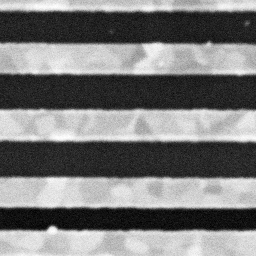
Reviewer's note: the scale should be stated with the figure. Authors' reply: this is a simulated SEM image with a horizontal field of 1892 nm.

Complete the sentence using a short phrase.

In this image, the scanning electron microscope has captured lines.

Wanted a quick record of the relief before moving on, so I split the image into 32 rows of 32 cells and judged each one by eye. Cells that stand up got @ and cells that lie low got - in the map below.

@@@@@@@@@@@@@@@@@@@@@@@@@@@@@@@@
--------------------------------
--------------------------------
--------------------------------
--------------------------------
@@@@@@-------------@@-----@-----
@@@@@@@@@@@@@@@@@@@@@@@@@@@@@@@@
@@@@@@@@@@@@@@@@@@@@@@@@@@@@@@@@
@@@@@@@@@@@@@@@@@@@@@@@@@@@@@@@@
--------------------------------
--------------------------------
--------------------------------
--------------------------------
--------------------------------
@@@@@@@@@@@@@@@@@@@@@@@@@@@@@@@@
@@@@@@@@@@@@@@@@@@@@@@@@@@@@@@@@
@@@@@@@@@@@@@@@@@@@@@@@@@@@@@@@@
--------------------------------
--------------------------------
--------------------------------
--------------------------------
--------------------------------
@@@@@@@@@@@@@@@@@@@@@@@@@@@@@@@@
@@@@@@@@@@@@@@@@@@@@@@@@@@@@@@@@
@@@@@@@@@@@@@@@@@@@@@@@@@@@@@@@@
@@@@@@@@@@@@@@@@@@@@@@@@@@@@@@@@
--------------------------------
--------------------------------
------@-------------------------
@@@@@@@@@@@@@@@@@@@@@@@@@@@@@@@@
@@@@@@@@@@@@@@@@@@@@@@@@@@@@@@@@
@@@@@@@@@@@@@@@@@@@@@@@@@@@@@@@@